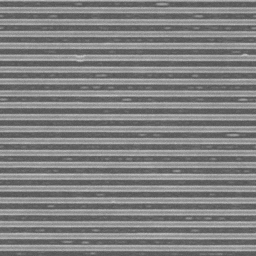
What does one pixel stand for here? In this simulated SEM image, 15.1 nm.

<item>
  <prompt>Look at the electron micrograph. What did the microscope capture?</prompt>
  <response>parallel lines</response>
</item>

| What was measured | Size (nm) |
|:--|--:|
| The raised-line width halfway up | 83.1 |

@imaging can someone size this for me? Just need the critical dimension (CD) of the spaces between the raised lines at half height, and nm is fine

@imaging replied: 98.2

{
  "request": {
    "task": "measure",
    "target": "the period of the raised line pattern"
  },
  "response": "180 nanometres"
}